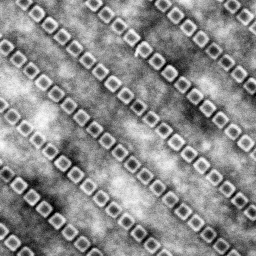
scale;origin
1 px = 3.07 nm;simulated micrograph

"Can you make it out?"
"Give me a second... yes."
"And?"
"a regular array of raised bodies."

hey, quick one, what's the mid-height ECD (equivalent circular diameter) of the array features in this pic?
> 42.1 nanometers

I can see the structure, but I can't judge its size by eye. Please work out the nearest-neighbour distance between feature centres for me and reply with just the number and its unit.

52.6 nanometers